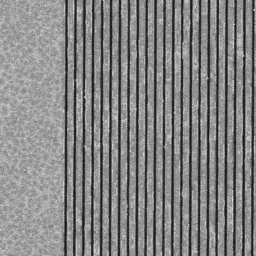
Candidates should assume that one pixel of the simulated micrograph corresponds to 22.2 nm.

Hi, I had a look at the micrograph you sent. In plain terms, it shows parallel lines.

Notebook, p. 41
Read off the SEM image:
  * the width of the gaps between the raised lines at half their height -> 61.1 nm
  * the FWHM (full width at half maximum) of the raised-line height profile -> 144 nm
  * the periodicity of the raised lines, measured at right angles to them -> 198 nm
